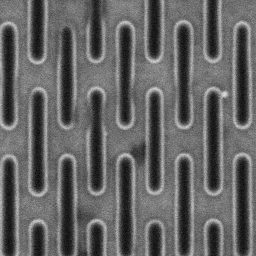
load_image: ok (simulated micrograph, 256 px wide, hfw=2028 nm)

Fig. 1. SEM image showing groups of lines, slits or small figures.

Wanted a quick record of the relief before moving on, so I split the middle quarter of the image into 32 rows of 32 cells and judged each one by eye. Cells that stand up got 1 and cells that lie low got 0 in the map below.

11100000000001111000000000001111
11100000000001111000000000001111
11100000000001111000000000001111
11100000000001111000000000001111
11100000000001111000000000001111
11100000000001111000000000001111
11100001110001111000011100001111
11100011110000111000011100001111
11100011110000111000011100001111
11100011110000111000011110001111
11100011110001111000011110001111
11100011110001111000011110001111
11000001110001111000011110001111
11000001110001111000011110001111
11000001110001111000011110001111
11000011110000111000011110000110
00000011110000000000011110000000
00000011110000000000011110000000
00000011110000000000011110000000
00000011110000000000011110000000
00000011110000000000011110000000
00000011110000000000011110000000
00000011110000000000011110000000
11000011110000111000011110001111
11100011110001111000011110001111
11100011110001111000011110001111
11100011110001111000011110001111
11100011110001111000011110001111
11100011110001111000011110001111
11100011110001111000011110001111
11100011110001111000011110001111
11100011110001111000011100001111